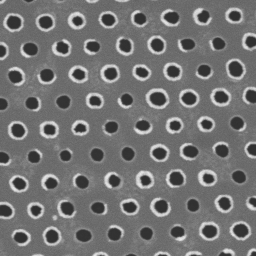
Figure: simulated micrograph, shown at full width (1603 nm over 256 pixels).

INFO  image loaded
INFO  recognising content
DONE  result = a regular array of holes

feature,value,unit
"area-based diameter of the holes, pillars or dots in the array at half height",79.3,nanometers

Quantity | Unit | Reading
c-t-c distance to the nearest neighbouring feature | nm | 191